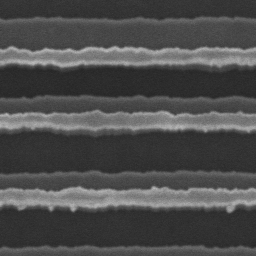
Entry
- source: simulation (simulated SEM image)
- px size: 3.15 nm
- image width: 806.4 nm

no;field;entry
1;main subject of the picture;lines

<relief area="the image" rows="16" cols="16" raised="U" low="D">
DDDDDDDDDDDDDDDD
UUUUUUUUUUUUUUUU
UUUUUUUUUUUUUUUU
UUUUUUUUUUUUUUUU
DDDDDDDDDDDDDDDD
DDDDDDDDDDDDDDDD
UUUUUUUUUUUUUUUU
UUUUUUUUUUUUUUUU
DDDDDDDDDDDDDDDD
DDDDDDDDDDDDDDDD
DDDDDDDDDDDDDDDD
UUUUUUUUUUUUUUUU
UUUUUUUUUUUUUUUU
DDDDDDDDDDDDDDDD
DDDDDDDDDDDDDDDD
UUUUUUUUUUUUUDUU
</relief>